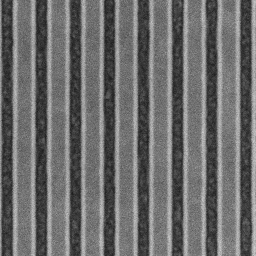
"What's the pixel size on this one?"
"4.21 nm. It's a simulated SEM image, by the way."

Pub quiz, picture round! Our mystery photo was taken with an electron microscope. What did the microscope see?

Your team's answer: parallel lines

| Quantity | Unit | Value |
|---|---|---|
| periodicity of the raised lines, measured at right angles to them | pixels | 34.1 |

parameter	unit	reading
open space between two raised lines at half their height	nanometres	63.7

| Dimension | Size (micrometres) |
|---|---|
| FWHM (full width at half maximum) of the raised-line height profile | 0.0784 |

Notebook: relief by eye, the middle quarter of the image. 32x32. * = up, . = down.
*....****....*****....****....**
*....****....*****....****....**
*....****....*****....****....**
*....****....*****....****....**
*....****....*****....****....**
*....****....*****....*****...**
*....****....*****....****....**
*....****....*****....****....**
*....****....*****....****....**
*....****....*****....****....**
*....****....*****....****....**
*....****....*****....****....**
*....****....*****....*****...**
*....****....*****....****....**
*....****....*****....*****...**
*....****....*****....*****...**
*....****....*****....****....**
*....****....*****....****....**
*....****....*****....*****...**
*....****....*****....****....**
*....****....*****....****....**
*....****....*****....****.....*
*....****....*****....****.....*
*....****....*****....****....**
*....****....*****....****....**
*....****....*****....****....**
*....****....*****....****....**
*....****....*****....****....**
*....****....*****....****....**
*....****....*****....****....**
*....****....*****....****....**
*....****....*****....****....**